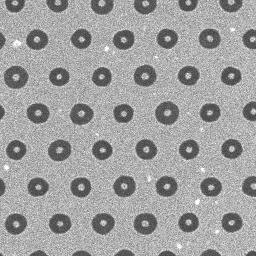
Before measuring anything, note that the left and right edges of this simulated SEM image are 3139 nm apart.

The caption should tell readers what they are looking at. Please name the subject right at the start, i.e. a regular array of ring-shaped grooves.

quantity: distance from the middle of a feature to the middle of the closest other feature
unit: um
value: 0.515